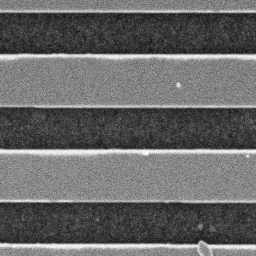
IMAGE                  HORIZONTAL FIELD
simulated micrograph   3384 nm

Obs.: lines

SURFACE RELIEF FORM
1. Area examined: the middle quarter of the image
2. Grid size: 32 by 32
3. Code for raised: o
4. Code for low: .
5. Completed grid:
oooooooooooooooooooooooooooooooo
oooooooooooooooooooooooooooooooo
oooooooooooooooooooooooooooooooo
oooooooooooooooooooooooooooooooo
oooooooooooooooooooooooooooooooo
oooooooooooooooooooooooooooooooo
oooooooooooooooooooooooooooooooo
oooooooooooooooooooooooooooooooo
oooooooooooooooooooooooooooooooo
oooooooooooooooooooooooooooooooo
oooooooooooooooooooooooooooooooo
................................
................................
................................
................................
................................
................................
................................
................................
................................
................................
................................
oooooooooooooooooooooooooooooooo
oooooooooooooooooooooooooooooooo
oooooooooooooooooooooooooooooooo
oooooooooooooooooooooooooooooooo
oooooooooooooooooooooooooooooooo
oooooooooooooooooooooooooooooooo
oooooooooooooooooooooooooooooooo
oooooooooooooooooooooooooooooooo
oooooooooooooooooooooooooooooooo
oooooooooooooooooooooooooooooooo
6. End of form